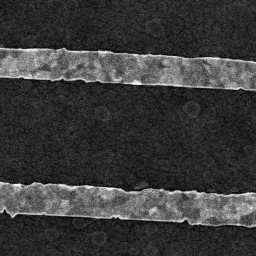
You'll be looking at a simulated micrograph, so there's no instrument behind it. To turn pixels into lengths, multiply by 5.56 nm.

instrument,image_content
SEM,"one or a few lines or trenches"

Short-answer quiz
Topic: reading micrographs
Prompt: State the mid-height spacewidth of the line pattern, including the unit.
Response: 0.587 microns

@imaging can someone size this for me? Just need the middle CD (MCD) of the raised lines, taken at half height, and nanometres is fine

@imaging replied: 162